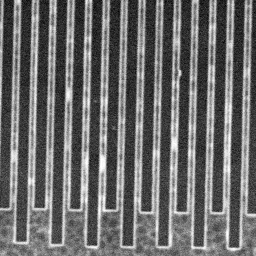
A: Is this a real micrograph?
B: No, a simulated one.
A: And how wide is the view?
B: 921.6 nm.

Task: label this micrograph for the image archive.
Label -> parallel lines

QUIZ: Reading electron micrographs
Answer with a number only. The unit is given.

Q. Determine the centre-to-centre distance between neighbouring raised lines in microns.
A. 0.0639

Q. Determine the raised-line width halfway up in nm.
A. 21.6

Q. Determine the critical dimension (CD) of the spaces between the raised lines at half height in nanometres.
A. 41.9